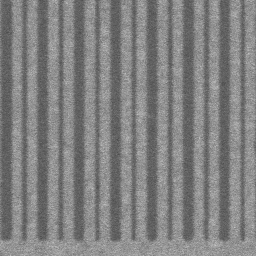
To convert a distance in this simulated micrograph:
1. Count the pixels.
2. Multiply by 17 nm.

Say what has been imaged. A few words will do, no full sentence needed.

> parallel lines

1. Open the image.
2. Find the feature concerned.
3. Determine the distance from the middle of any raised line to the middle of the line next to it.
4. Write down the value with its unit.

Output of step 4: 305 nanometres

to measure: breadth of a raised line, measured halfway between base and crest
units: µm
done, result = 0.164